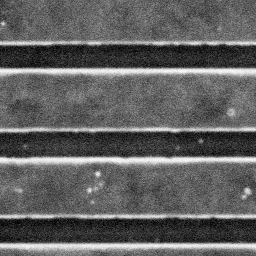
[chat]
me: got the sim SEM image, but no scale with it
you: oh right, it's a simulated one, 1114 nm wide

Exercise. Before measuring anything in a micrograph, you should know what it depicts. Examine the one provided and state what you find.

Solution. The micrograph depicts lines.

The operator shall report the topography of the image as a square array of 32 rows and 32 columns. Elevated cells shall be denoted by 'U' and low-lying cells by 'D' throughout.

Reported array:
UUUUUUUUUUUUUUUUUUUUUUUUUUUUUUUU
UUUUUUUUUUUUUUUUUUUUUUUUUUUUUUUU
UUUUUUUUUUUUUUUUUUUUUUUUUUUUUUUU
UUUUUUUUUUUUUUUUUUUUUUUUUUUUUUUU
UUUUUUUUUUUUUUUUUUUUUUUUUUUUUUUU
DDDDDDDDDDDDDDDDDDDDDDDDDDDDDDDD
DDDDDDDDDDDDDDDDDDDDDDDDDDDDDDDD
DDDDDDDDDDDDDDDDDDDDDDDDDDDDDDDD
DDDDDDDDDDDDDDDDDDDDDDDDDDDDDDDD
UUUUUUUUUUUUUUUUUUUUUUUUUUUUUUUU
UUUUUUUUUUUUUUUUUUUUUUUUUUUUUUUU
UUUUUUUUUUUUUUUUUUUUUUUUUUUUUUUU
UUUUUUUUUUUUUUUUUUUUUUUUUUUUUUUU
UUUUUUUUUUUUUUUUUUUUUUUUUUUUUUUU
UUUUUUUUUUUUUUUUUUUUUUUUUUUUUUUU
UUUUUUUUUUUUUUUUUUUUUUUUUUUUUUUU
DDDDDDDDDDDDDDDDDDDDDDDDDDDDDDDD
DDDDDDDDDDDDDDDDDDDDDDDDDDDDDDDD
DDDDDDDDDDDDDDDDDDDDDDDDDDDDDDDD
DDDDDDDDDDDDDDDDDDDDDDDDDDDDDDDD
UUUUUUUUUUUUUUUUUUUUUUUUUUUUUUUU
UUUUUUUUUUUUUUUUUUUUUUUUUUUUUUUU
UUUUUUUUUUUUUUUUUUUUUUUUUUUUUUUU
UUUUUUUUUUUUUUUUUUUUUUUUUUUUUUUU
UUUUUUUUUUUUUUUUUUUUUUUUUUUUUUUU
UUUUUUUUUUUUUUUUUUUUUUUUUUUUUUUU
UUUUUUUUUUUUUUUUUUUUUUUUUUUUUUUU
DDDDDDDDDDDDDDDDDDDDDDDDDDDDDDDD
DDDDDDDDDDDDDDDDDDDDDDDDDDDDDDDD
DDDDDDDDDDDDDDDDDDDDDDDDDDDDDDDD
DDDDDDDDDDDDDDDDDDDDDDDDDDDDDDDD
UUUUUUUUUUUUUUUUUUUUUUUUUUUUUUUU